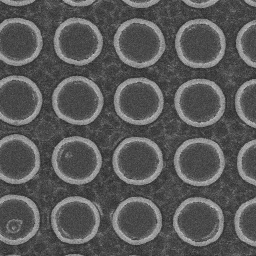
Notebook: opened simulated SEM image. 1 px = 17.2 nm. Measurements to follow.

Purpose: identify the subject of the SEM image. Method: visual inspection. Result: a regular array of raised bodies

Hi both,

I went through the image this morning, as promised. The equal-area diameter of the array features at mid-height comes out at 772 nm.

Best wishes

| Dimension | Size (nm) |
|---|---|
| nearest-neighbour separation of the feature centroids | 1020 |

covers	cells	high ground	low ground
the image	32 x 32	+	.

.........+......+++.....++......
................................
................................
++++....++++...++++....++++....+
+++++..+++++...+++++..++++++..++
+++++..++++++..+++++..++++++..++
+++++..+++++...+++++..++++++..++
.+++....+++.....+++....++++....+
................................
................................
++++....+++.....+++.....++.....+
+++++..+++++...+++++..+++++...++
+++++..++++++..+++++..++++++..++
+++++..+++++...+++++..++++++..++
++++....++++...++++....++++...++
.........................+.....+
................................
.++......+......++..............
++++...+++++...++++....++++....+
+++++..+++++..++++++..++++++..++
+++++..+++++..++++++..++++++..++
++++...+++++...+++++..++++++..++
.++......++.....+++....++++....+
................................
................................
++++....+++....++++....+++.....+
++++...+++++...+++++..+++++...++
+++++..+++++..++++++..++++++..++
++++...+++++...+++++..++++++..++
++++...++++....++++....++++...++
................................
................................